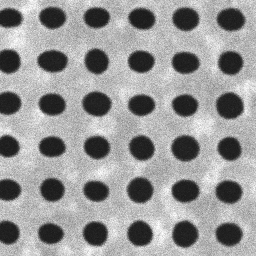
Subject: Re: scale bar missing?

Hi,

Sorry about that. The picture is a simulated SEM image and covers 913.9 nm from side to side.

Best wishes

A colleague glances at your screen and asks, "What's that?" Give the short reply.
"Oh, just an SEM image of a regular array of holes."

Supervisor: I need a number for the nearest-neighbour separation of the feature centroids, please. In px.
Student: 42.7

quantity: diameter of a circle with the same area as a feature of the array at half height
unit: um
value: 0.0872